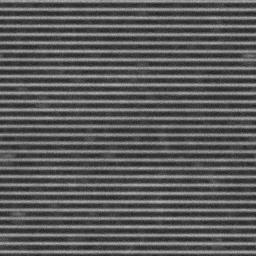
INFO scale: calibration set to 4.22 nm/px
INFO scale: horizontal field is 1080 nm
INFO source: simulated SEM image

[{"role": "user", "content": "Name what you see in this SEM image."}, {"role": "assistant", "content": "parallel lines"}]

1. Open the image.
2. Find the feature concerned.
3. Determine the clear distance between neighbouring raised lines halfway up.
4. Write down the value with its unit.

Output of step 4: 0.0274 µm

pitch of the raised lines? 35.3 nm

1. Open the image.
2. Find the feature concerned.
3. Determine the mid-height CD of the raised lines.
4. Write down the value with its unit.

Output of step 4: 0.0079 um